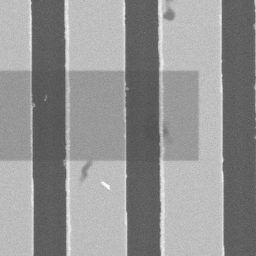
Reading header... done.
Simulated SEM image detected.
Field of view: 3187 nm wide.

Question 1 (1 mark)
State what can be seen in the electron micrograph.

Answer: lines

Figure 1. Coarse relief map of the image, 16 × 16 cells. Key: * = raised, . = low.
**..****..****..
**..****..****..
**..****..****..
**..****..****..
**..****..****..
**..****..****..
**..****..****..
**..****..****..
**..****..****..
**..****..****..
**..****..****..
**..****..****..
**..****..****..
**..****..****..
**..****..****..
**..****..****..